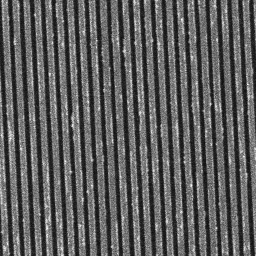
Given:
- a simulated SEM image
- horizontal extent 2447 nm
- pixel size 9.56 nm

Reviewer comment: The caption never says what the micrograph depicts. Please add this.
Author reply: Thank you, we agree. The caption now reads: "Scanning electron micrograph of parallel lines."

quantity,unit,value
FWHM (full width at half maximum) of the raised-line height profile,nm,56.1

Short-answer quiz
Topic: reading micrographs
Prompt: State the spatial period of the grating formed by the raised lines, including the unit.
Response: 105 nm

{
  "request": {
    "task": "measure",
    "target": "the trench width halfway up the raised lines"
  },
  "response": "5 px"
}